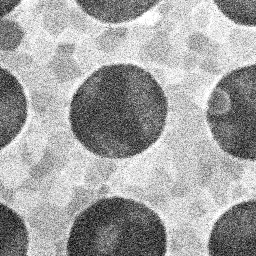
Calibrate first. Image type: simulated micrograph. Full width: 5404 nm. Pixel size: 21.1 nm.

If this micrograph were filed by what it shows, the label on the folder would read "holes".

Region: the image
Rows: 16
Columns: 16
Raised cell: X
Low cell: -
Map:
-XXXX-----XXXX--
XXXXXXXXXXXXXXX-
XXXXXXXXXXXXXXXX
XXXXXXXXXXXXXXXX
-XXXXX---XXXXX--
-XXXX-----XXX---
--XX------XXX---
--XX------XXX---
-XXXX-----XXX---
XXXXXX---XXXXX--
XXXXXXXXXXXXXXXX
XXXXXXXXXXXXXXXX
XXXXXX--XXXXXXXX
-XXXX-----XXXX--
--XX------XXX---
--XX------XXX---